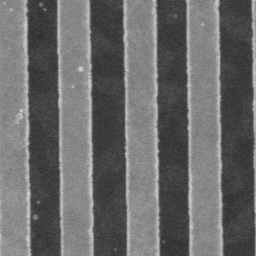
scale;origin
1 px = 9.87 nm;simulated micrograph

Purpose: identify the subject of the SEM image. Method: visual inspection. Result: lines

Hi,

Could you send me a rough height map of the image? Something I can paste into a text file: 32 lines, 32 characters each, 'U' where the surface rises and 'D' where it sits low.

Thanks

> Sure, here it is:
UUUDDDDUUUUDDDDDUUUDDDDUUUUDDDDD
UUUDDDDUUUUDDDDDUUUDDDDUUUUDDDDD
UUUDDDDUUUUDDDDDUUUDDDDUUUUDDDDD
UUUDDDDUUUUDDDDDUUUDDDDUUUUDDDDD
UUUDDDDUUUUDDDDDUUUDDDDUUUUDDDDD
UUUDDDDUUUUDDDDDUUUUDDDUUUUDDDDD
UUUDDDDUUUUDDDDDUUUUDDDUUUUDDDDD
UUUDDDDUUUUDDDDDUUUUDDDUUUUDDDDD
UUUDDDDUUUUDDDDDUUUUDDDDUUUDDDDD
UUUDDDDUUUUDDDDDUUUUDDDDUUUDDDDD
UUUDDDDUUUUDDDDDUUUUDDDDUUUDDDDD
UUUDDDDUUUUDDDDDUUUUDDDDUUUDDDDD
UUUDDDDUUUUDDDDDUUUUDDDDUUUDDDDD
UUUDDDDUUUUDDDDDUUUUDDDDUUUDDDDD
UUUDDDDUUUUDDDDDUUUUDDDDUUUDDDDD
UUUDDDDUUUUDDDDDUUUUDDDDUUUUDDDD
UUUUDDDUUUUDDDDDUUUUDDDDUUUUDDDD
UUUDDDDUUUUDDDDDUUUUDDDDUUUUDDDD
UUUDDDDUUUUDDDDDUUUUDDDDUUUUDDDD
UUUUDDDUUUUDDDDDUUUUDDDDUUUUDDDD
UUUUDDDUUUUDDDDDUUUUDDDDUUUUDDDD
UUUUDDDDUUUDDDDDUUUUDDDDUUUUDDDD
UUUUDDDDUUUDDDDDUUUUDDDDUUUUDDDD
UUUUDDDDUUUDDDDDUUUUDDDDUUUUDDDD
UUUUDDDDUUUDDDDDUUUUDDDDUUUUDDDD
UUUUDDDDUUUDDDDDUUUUDDDDUUUUDDDD
UUUUDDDDUUUDDDDDUUUUDDDDUUUUDDDD
UUUUDDDDUUUUDDDDUUUUDDDDUUUUDDDD
UUUUDDDDUUUDDDDDUUUUDDDDUUUUDDDD
UUUUDDDDUUUUDDDDUUUUDDDDUUUUDDDD
UUUUDDDDUUUUDDDDUUUUDDDDUUUUDDDD
UUUUDDDDUUUUDDDDUUUUDDDDUUUUDDDD